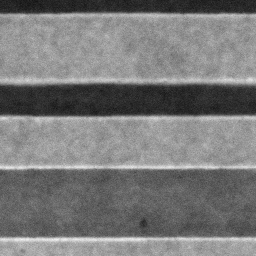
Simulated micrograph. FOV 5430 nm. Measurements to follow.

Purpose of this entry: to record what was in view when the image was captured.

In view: lines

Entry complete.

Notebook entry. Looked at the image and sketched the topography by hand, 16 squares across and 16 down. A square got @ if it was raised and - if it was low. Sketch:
----------------
@@@@@@@@@@@@@@@@
@@@@@@@@@@@@@@@@
@@@@@@@@@@@@@@@@
@@@@@@@@@@@@@@@@
----------------
----------------
@@@@@@@@@@@@@@@@
@@@@@@@@@@@@@@@@
@@@@@@@@@@@@@@@@
----------------
----------------
----------------
----------------
----------------
@@@@@@@@@@@@@@@@